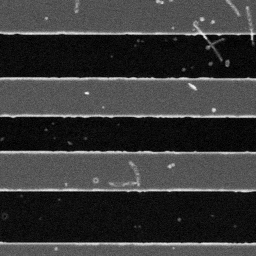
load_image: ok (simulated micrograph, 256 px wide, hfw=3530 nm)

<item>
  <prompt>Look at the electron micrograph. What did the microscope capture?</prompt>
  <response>lines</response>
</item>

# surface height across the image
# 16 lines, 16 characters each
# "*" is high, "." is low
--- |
****************
****************
................
................
................
****************
****************
................
................
***********....*
****************
****************
................
................
................
****************